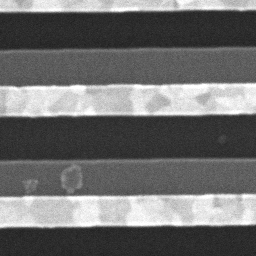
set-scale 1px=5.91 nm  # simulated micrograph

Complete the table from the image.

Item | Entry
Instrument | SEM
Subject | lines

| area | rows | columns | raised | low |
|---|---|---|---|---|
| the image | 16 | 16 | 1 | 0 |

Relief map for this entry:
1111111111111111
0000000000000000
0000000000000000
1111111111111111
1111111111111111
1111111111111111
1111111111111111
0000000000000000
0000000000000000
0000000000000000
1111111111111111
1111111111111111
1111111111111111
1111111111111111
0000000000000000
0000000000000000